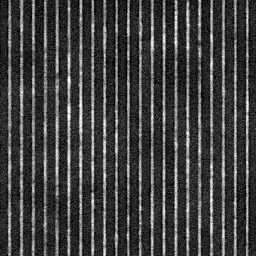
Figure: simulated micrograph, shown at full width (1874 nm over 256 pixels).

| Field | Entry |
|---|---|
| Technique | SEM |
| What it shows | parallel lines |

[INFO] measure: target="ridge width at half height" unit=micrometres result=0.0137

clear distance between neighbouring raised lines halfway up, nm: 73.2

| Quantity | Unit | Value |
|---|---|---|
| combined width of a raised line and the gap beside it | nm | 87.1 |